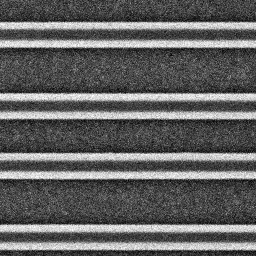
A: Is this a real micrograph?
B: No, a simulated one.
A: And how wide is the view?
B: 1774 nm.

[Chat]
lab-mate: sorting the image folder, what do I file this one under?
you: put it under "one or a few lines or trenches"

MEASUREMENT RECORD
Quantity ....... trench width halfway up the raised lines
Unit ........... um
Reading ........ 0.366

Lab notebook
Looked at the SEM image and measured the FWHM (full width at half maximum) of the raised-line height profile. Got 126 nanometers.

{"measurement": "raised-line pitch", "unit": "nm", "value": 467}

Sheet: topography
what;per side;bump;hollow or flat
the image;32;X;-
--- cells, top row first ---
--------------------------------
--------------------------------
--------------------------------
XXXXXXXXXXXXXXXXXXXXXXXXXXXXXXXX
XXXXXXXXXXXXXXXXXXXXXXXXXXXXXXXX
--------------------------------
--------------------------------
--------------------------------
--------------------------------
--------------------------------
--------------------------------
--------------------------------
XXXXXXXXXXXXXXXXXXXXXXXXXXXXXXXX
XXXXXXXXXXXXXXXXXXXXXXXXXXXXXXXX
--------------------------------
--------------------------------
--------------------------------
--------------------------------
--------------------------------
--------------------------------
XXXXXXXXXXXXXXXXXXXXXXXXXXXXXXXX
XXXXXXXXXXXXXXXXXXXXXXXXXXXXXXXX
--------------------------------
--------------------------------
--------------------------------
--------------------------------
--------------------------------
--------------------------------
--------------------------------
XXXXXXXXXXXXXXXXXXXXXXXXXXXXXXXX
XXXXXXXXXXXXXXXXXXXXXXXXXXXXXXXX
--------------------------------